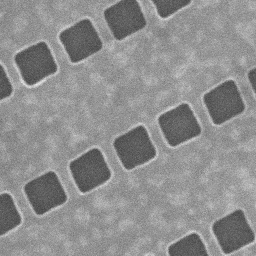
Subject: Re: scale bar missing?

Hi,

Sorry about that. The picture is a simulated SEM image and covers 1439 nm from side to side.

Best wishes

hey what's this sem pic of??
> holes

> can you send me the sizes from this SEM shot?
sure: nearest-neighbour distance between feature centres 281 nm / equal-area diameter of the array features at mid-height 226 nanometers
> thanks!